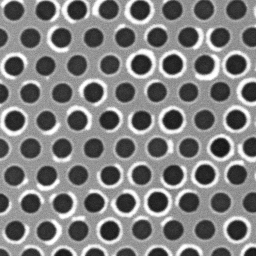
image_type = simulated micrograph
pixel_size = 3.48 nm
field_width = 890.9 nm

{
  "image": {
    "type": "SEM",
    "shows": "a regular array of holes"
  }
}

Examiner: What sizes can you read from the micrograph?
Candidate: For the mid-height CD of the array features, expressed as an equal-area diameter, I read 73.1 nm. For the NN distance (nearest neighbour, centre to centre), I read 109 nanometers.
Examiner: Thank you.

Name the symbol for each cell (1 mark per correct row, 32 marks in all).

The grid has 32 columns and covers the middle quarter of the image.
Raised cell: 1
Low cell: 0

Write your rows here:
00000011100000111000001100000011
10000011100000111000001110000011
11000111110011111100011111001111
11111111111111111111111111111111
11111110111111101111111011111111
01111000001110000111100001111000
00111000001110000011100000111000
00111000001110000011100000111000
00111000001110000011100001111000
01111100011111000111110011111100
11111111111111111111111111111111
11101111111111111110111111001111
10000111100001111000001110000111
10000011100000111000001110000011
10000011100000111000001110000011
10000011100001111000001110000111
11000111111011111100111111001111
11111111111111111111111111111111
11111110111111101111110001111100
00111000001110000111100000111000
00111000001110000011100000110000
00111000001110000011100000111000
00111000001110000111100000111000
01111100011111001111111011111100
11111111111111111111111111111111
11100111110001111100011111000111
10000011100000111000001110000011
10000011100000111000001110000011
10000011100000111000001110000011
11000111100000111000011110000111
11111111111011111110111111101111
11111111111111111111111111111111